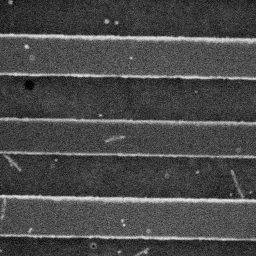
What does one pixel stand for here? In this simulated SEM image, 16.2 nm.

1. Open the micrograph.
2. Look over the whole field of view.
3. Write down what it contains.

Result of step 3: lines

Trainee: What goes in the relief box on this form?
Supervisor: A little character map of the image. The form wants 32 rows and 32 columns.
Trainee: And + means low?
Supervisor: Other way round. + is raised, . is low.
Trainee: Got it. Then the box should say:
................................
................................
................................
................................
++++.+..........................
++++++++++++++++++++++++++++++++
++++++++++++++++++++++++++++++++
++++++++++++++++++++++++++++++++
++++++++++++++++++++++++++++++++
...............+++++++++++++++++
................................
................................
................................
................................
................................
++++++++++++++++++++++++++++++++
++++++++++++++++++++++++++++++++
++++++++++++++++++++++++++++++++
++++++++++++++++++++++++++++++++
.....................+++++++++++
................................
................................
................................
................................
................................
++++++++++++++++++++++++++++++++
++++++++++++++++++++++++++++++++
++++++++++++++++++++++++++++++++
++++++++++++++++++++++++++++++++
...+++++++++++++++++++++++++++++
................................
................................